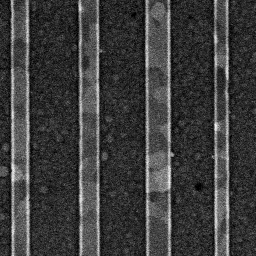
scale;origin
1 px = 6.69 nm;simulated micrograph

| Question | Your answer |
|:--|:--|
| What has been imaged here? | one or a few lines or trenches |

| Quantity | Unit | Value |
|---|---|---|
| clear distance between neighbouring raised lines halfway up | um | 0.327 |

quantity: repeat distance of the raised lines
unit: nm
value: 449